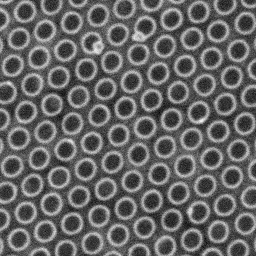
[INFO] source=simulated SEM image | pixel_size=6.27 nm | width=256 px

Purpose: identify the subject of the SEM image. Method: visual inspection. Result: a regular array of raised bodies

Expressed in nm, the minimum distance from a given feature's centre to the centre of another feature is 171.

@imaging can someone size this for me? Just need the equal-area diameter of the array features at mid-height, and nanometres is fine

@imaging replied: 127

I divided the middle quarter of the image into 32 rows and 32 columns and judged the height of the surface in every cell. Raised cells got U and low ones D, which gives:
DDDUUUUUDDUUUUDDDDDDDDUUUUDDUUUU
UDDUUUUUDDUUUDDDDDDDDUUUUUDDUUUU
UDDUUUUUDDDDDDDDUUDDDUUUUUDDDUUU
UDDDUUUDDDDDDDDUUUUDDUUUUUDDDDDD
UDDDDDDDDUUUDDUUUUUDDDUUUDDDDDDD
DDDDDDDDUUUUUDDUUUUDDDDDDDDUUUDD
DDUUUUDDUUUUUDDUUUDDDDDDDDUUUUUD
DUUUUUDDUUUUDDDDDDDDUUUUDDUUUUUD
DUUUUUDDDUUDDDDUDDDDUUUUDDUUUUUD
DUUUUUDDDDDDDUUUUDDDUUUUDDDDUDDD
DDUUUDDDUUDDDUUUUUDDUUUUDDDDDDDD
DDDDDDDUUUUDDUUUUUDDDUDDDDUUDDDU
DDUDDDDUUUUDDUUUUDDDDDDDDUUUUDDU
UUUUDDUUUUUDDDDUDDDUUDDDDUUUUDDU
UUUUUDDUUUDDDDDDDDUUUUDDDUUUUDDD
UUUUDDDDDDDDDUUDDDUUUUUDDUUUUDDD
UUUUDDDDDDDDUUUUDDUUUUUDDDDDDDDU
DDDDDDUUDDDUUUUUDDUUUUDDDDDDDDUU
DDDDDUUUUDDUUUUUDDDDDDDDUUUDDUUU
UUDDDUUUUDDDUUUDDDDDDDDUUUUUDUUU
UUUDDUUUUDDDDDDDDUUUDDDUUUUUDDUU
UUUDDUUUUDDDDDDDDUUUUDDUUUUDDDDD
UUUDDDDDDDDUUUDDUUUUUDDUUUUDDDDD
UUDDDDDDDDUUUUUDUUUUUDDDDDDDDUUU
DDDDUUUDDDUUUUUDDUUUDDDDDDDDUUUU
DDDUUUUUDDUUUUDDDDDDDDUUUUDDUUUU
UDDUUUUUDDUUUDDDDDDDDDUUUUDDUUUU
UDDUUUUDDDDDDDDDUUUDDUUUUUDDDUUU
UDDDUUUDDDDDDDDUUUUDDUUUUUDDDDDD
UDDDDDDDDUUUDDDUUUUDDDUUUDDDDDDD
DDDDDDDDUUUUUDDUUUUDDDDDDDDUUUUD
DDUUUUDDUUUUUDDDUUDDDDDDDDUUUUUD